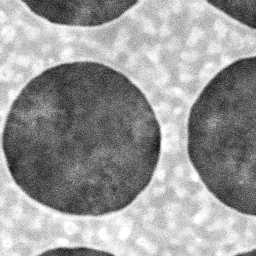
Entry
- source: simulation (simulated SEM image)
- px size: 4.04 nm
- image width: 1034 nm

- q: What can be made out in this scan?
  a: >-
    holes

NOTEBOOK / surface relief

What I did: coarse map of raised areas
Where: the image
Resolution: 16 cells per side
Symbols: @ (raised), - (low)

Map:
@@------@@@@@@--
@@@@--@@@@@@@@@-
@@@@@@@@@@@@@@@@
@@@@@@@@@@@@@@@@
@@@----@@@@@@@--
@--------@@@@---
@--------@@@----
----------@@----
----------@@----
----------@@----
@---------@@----
@--------@@@@---
@@------@@@@@@--
@@@@---@@@@@@@@@
@@@@@@@@@@@@@@@@
@@@---@@@@@@@@@@